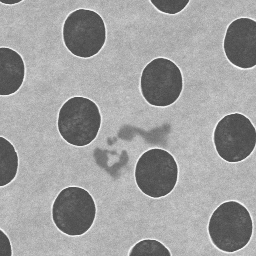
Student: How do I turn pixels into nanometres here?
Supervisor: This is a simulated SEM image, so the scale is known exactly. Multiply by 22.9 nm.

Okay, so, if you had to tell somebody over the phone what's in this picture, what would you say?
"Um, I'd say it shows holes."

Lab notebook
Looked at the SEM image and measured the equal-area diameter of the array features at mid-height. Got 1050 nm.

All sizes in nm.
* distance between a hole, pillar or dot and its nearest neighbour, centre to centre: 2070